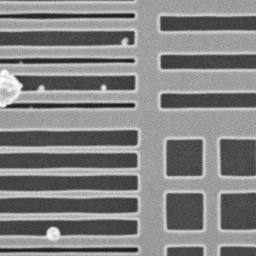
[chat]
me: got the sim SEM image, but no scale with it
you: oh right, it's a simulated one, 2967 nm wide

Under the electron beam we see groups of lines, slits or small figures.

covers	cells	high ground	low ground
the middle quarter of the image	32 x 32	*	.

************************........
********************************
********************************
..................**************
..................**************
..................**************
..................**************
************************........
************************........
****.....*****...*******........
..................******........
********************************
********************************
********************************
********************************
********************************
**................**************
...................*************
...................*************
...................******.......
..................*******.......
*************************.......
..................*******.......
...................******.......
...................******.......
...................******.......
*************************.......
*************************.......
...................*************
...................*************
...................*************
..................**************